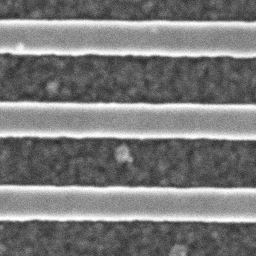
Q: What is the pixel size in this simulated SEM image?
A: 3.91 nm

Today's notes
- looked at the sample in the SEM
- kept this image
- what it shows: lines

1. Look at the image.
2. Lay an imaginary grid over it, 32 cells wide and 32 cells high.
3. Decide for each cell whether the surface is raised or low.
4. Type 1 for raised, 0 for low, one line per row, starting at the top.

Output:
00000000000000000000000000000000
00000000000000000000000000000000
00000000000000000000000000000000
11111111111111111111111111111111
11111111111111111111111111111111
11111111111111111111111111111111
11111111111111111111111111111111
00000000000000000000000000000000
00000000000000000000000000000000
00000000000000000000000000000000
00000000000000000000000000000000
00000000000000000000000000000000
00000000000000000000000000000000
11111111111111111111111111111111
11111111111111111111111111111111
11111111111111111111111111111111
11111111111111111111111111111111
00000000000000000000000000000000
00000000000000000000000000000000
00000000000000000000000000000000
00000000000000000000000000000000
00000000000000000000000000000000
00000000000000000000000000000000
11111111111100110100000000000000
11111111111111111111111111111111
11111111111111111111111111111111
11111111111111111111111111111111
00100001110111111001111111111111
00000000000000000000000000000000
00000000000000000000000000000000
00000000000000000000000000000000
00000000000000000000000000000000